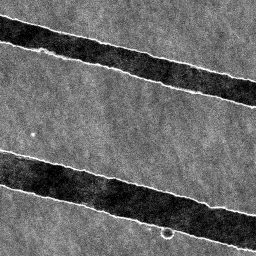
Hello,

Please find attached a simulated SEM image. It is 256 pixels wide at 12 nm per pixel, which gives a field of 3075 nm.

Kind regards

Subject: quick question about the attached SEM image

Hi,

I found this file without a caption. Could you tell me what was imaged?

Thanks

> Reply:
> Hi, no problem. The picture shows one or a few lines or trenches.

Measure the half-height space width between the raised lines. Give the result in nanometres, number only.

1250